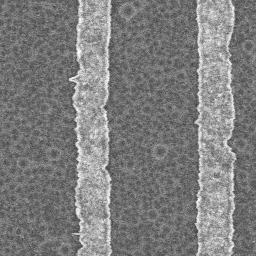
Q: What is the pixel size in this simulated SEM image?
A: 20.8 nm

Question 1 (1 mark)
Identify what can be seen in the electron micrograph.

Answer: one or a few lines or trenches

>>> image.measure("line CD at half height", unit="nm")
641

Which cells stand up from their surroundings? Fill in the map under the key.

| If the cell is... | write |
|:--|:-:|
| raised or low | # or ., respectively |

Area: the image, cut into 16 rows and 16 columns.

.....##.....###.
.....##.....###.
.....##.....##..
.....##......#..
.....##.....##..
.....##.....##..
.....##.....###.
.....##.....###.
.....##.....##..
.....##......#..
.....##......##.
.....##......##.
.....##.....###.
.....##.....##..
.....##.....##..
.....##.....##..